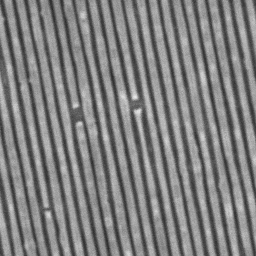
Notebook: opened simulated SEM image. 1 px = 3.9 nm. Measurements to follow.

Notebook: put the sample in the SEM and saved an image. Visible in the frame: parallel lines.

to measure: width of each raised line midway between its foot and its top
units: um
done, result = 0.0264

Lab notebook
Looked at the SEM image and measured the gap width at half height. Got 19.1 nm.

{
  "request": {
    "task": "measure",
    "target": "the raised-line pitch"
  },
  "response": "46.2 nm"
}